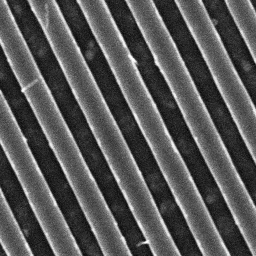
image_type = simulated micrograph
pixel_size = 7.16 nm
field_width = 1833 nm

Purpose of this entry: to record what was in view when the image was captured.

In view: parallel lines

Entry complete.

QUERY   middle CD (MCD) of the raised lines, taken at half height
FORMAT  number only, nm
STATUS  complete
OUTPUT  165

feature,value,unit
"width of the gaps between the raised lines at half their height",0.145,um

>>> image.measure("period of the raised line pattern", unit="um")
0.315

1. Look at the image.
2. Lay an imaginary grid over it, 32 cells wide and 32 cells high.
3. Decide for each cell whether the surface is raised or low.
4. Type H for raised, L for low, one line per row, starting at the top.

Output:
HLLLHHHLLLHHHLLLHHHLLLHHHLLLHHHL
HLLLHHHHLLHHHHLLLHHHLLLHHHLLLHHH
HHLLLHHHLLLHHHLLLHHHLLLHHHLLLHHH
HHLLLHHHHLLHHHHLLHHHHLLLHHHLLLHH
HHHLLLHHHLLLHHHLLLHHHLLLHHHLLLHH
HHHLLLHHHHLLHHHHLLHHHHLLLHHHLLLH
LHHHLLLHHHLLLHHHLLLHHHLLLHHHLLLH
LHHHLLLHHHLLLHHHHLLHHHHLLLHHHLLL
LLHHHLLLHHHLLLHHHLLLHHHLLLHHHLLL
LLHHHLLLHHHLLLHHHHLLHHHHLLLHHHLL
LLLHHHLLLHHHLLLHHHLLLHHHLLLHHHLL
LLLHHHLLLHHHLLLHHHHLLLHHHLLLHHHL
HLLLHHHLLLHHHLLLHHHLLLHHHLLLHHHL
HLLLHHHLLLHHHLLLHHHHLLLHHHLLLHHH
HHLLLHHHLLLHHHLLLHHHLLLHHHLLLHHH
HHLLLHHHLLLHHHLLLHHHHLLHHHHLLHHH
HHHLLHHHHLLLHHHLLLHHHLLLHHHLLLHH
HHHLLLHHHLLLHHHLLLHHHLLLHHHHLLLH
HHHHLLHHHHLLLHHHLLLHHHLLLHHHLLLH
LHHHLLLHHHLLLHHHLLLHHHLLLHHHHLLL
LHHHHLLLHHHLLLHHHLLLHHHLLLHHHLLL
LLHHHLLLHHHLLLHHHHLLHHHLLLHHHHLL
LLHHHHLLHHHHLLLHHHLLLHHHLLLHHHLL
LLLHHHLLLHHHLLLHHHLLLHHHLLLHHHHL
LLLHHHHLLLHHHLLLHHHLLLHHHLLLHHHL
HLLLHHHLLLHHHLLLHHHLLLHHHLLLHHHH
HLLLHHHHLLHHHHLLLHHHLLLHHHLLLHHH
HHLLLHHHLLLHHHLLLHHHLLLHHHLLLHHH
HHLLLHHHHLLHHHHLLLHHHLLLHHHLLLHH
HHHLLLHHHLLLHHHLLLHHHLLLHHHLLLHH
HHHLLLHHHHLLHHHHLLHHHHLLLHHHLLLH
LHHHLLLHHHLLLHHHLLLHHHLLLHHHLLLH